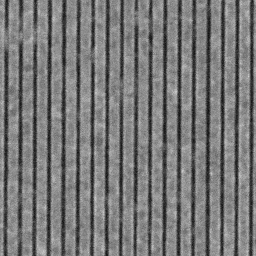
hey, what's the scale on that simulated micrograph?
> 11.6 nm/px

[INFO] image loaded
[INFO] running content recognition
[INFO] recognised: parallel lines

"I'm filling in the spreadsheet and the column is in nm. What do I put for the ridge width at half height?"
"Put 112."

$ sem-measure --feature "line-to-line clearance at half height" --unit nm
56.5